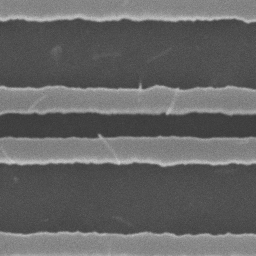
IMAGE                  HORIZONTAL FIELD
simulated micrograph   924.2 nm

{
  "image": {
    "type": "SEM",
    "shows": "lines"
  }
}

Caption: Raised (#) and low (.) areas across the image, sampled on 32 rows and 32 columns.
################################
################################
#..####....###...#..####......##
................................
................................
................................
................................
................................
................................
................................
................................
################################
################################
################################
................................
................................
................................
################################
################################
################################
..##................##....##....
................................
................................
................................
................................
................................
................................
................................
................................
######################.#########
################################
################################